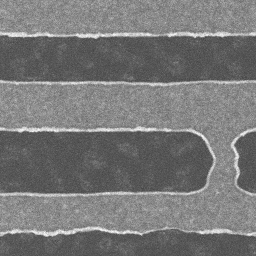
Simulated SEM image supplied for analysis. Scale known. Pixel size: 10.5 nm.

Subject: one or a few lines or trenches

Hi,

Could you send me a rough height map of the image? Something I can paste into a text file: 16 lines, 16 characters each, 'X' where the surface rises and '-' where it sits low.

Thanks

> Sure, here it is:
XXXXXXXXXXXXXXXX
XXXXXXXXXXXXXXXX
----------------
----------------
----------------
XXXXXXXXXXXXXXXX
XXXXXXXXXXXXXXXX
XXXXXXXXXXXXXXXX
------------XXX-
-------------XX-
-------------XX-
-------------XX-
XXXXXXXXXXXXXXXX
XXXXXXXXXXXXXXXX
XXXXX--XX---XXXX
----------------